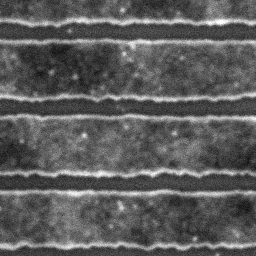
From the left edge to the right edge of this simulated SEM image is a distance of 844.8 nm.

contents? lines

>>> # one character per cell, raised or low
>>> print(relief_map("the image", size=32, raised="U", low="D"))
UUUUUUUUUUUUUUUUUUUUUUUUUUUUUUUU
UUUUUUUUUUUUUUUUUUUUUUUUUUUUUUUU
UUUUUUUUUUUUUUUUUUUUUUUUUUUUUUUU
DDDDDDDDDDDDDDDDDDDDDDDDDDDDDDDD
DDDDDDDDDDDDDDDDDDDDDDDDDDDDDDDD
UUUUUUUUUUUUUUUUUUUUUUUUUUUUUUUU
UUUUUUUUUUUUUUUUUUUUUUUUUUUUUUUU
UUUUUUUUUUUUUUUUUUUUUUUUUUUUUUUU
UUUUUUUUUUUUUUUUUUUUUUUUUUUUUUUU
UUUUUUUUUUUUUUUUUUUUUUUUUUUUUUUU
UUUUUUUUUUUUUUUUUUUUUUUUUUUUUUUU
UUUUUUUUUUUUUUUUUUUUUUUUUUUUUUUU
DDDUUDDDDDDDUDDDDDDUUUDDDDDDDDDD
DDDDDDDDDDDDDDDDDDDDDDDDDDDDDDDD
DUUUUDDDDUUUDDDUUUDDDDDDDDDDDDDD
UUUUUUUUUUUUUUUUUUUUUUUUUUUUUUUU
UUUUUUUUUUUUUUUUUUUUUUUUUUUUUUUU
UUUUUUUUUUUUUUUUUUUUUUUUUUUUUUUU
UUUUUUUUUUUUUUUUUUUUUUUUUUUUUUUU
UUUUUUUUUUUUUUUUUUUUUUUUUUUUUUUU
UUUUUUUUUUUUUUUUUUUUUUUUUUUUUUUU
UUUUUUUUUUUUUUUUUUUUDDUUUUUUUUUU
DDDDDDDDDDDDDDDDDDDDDDDDDDDDDDDD
DDDDDDDDDDDDDDDDDDDDDDDDDDDDDDDD
UUUUUUUUUUUUUUUUUUUUUUUUUUUUUUUU
UUUUUUUUUUUUUUUUUUUUUUUUUUUUUUUU
UUUUUUUUUUUUUUUUUUUUUUUUUUUUUUUU
UUUUUUUUUUUUUUUUUUUUUUUUUUUUUUUU
UUUUUUUUUUUUUUUUUUUUUUUUUUUUUUUU
UUUUUUUUUUUUUUUUUUUUUUUUUUUUUUUU
UUUUUUUUUUUUUUUUUUUUUUUUUUUUUUUU
DDDDDDDDDDDDDDDDDDDDDDDDDDDDDDDD